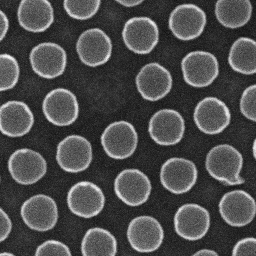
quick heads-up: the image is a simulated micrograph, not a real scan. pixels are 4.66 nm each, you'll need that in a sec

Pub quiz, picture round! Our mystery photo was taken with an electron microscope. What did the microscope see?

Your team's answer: a regular array of raised bodies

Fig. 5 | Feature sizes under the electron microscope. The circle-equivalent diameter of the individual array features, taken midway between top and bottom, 36.1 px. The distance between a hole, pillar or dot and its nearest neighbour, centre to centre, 222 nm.